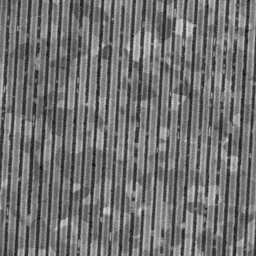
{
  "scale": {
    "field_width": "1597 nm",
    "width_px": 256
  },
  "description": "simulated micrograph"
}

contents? parallel lines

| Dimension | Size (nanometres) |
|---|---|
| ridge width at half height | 36.6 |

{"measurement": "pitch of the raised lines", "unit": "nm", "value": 64.8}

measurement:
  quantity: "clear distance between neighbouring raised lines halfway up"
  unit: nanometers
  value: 26.5